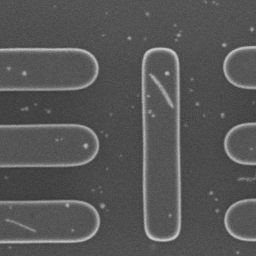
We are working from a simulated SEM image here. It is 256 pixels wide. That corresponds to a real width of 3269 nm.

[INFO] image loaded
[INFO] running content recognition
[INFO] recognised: groups of lines, slits or small figures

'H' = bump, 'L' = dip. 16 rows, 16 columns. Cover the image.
LLLLLLLLLLLLLLLL
LLLLLLLLLLLLLLLL
LLLLLLLLLLLLLLLL
HHHHHHLLLHHLLLHH
HHHHHHLLLHHLLLHH
HHHHHLLLLHHLLLLL
LLLLLLLLLHHLLLLL
LLLLLLLLLHHLLLLL
HHHHHHLLLHHLLLHH
HHHHHHLLLHHLLLHH
LLLLLLLLLHHLLLLL
LLLLLLLLLHHLLLLL
LLLLLLLLLHHLLLLH
HHHHHHLLLHHLLLHH
HHHHHHLLLHHLLLHH
LLLLLLLLLLLLLLLL